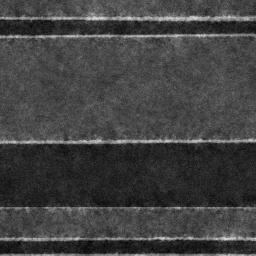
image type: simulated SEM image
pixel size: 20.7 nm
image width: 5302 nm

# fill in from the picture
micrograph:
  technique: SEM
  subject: lines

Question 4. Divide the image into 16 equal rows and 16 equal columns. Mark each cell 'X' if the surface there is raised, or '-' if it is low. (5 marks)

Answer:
XXXXXXXXXXXXXXXX
XXXXXXXXXXXXXXXX
XXXXXXXXXXXXXXXX
XXXXXXXXXXXXXXXX
XXXXXXXXXXXXXXXX
XXXXXXXXXXXXXXXX
XXXXXXXXXXXXXXXX
XXXXXXXXXXXXXXXX
XXXXXXXXXXXXXXXX
----------------
----------------
----------------
----------------
XXXXXXXXXXXXXXXX
XXXXXXXXXXXXXXXX
XXXXXXXXXXXXXXXX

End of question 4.